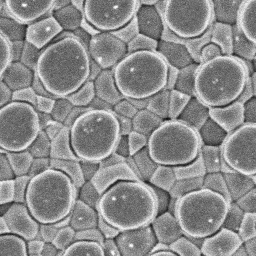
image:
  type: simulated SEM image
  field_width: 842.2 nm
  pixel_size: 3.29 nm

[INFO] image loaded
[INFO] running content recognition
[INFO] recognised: a regular array of raised bodies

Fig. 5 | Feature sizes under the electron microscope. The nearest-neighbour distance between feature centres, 0.246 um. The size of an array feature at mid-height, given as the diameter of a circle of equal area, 161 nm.